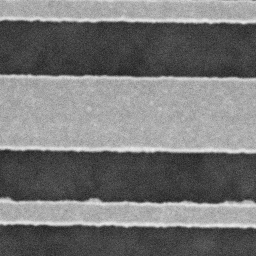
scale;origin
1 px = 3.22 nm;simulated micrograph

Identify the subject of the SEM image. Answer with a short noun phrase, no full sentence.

lines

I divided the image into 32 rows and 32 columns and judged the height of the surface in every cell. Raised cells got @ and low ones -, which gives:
@@@@@@@@@@@@@@@@@@@@@@@@@@@@@@@@
@@@@@@@@@@@@@@@@@@@@@@@@@@@@@@@@
---@-@@@@@@@@@@@@@@@@@@@@@@@@@@@
--------------------------------
--------------------------------
--------------------------------
--------------------------------
--------------------------------
--------------------------------
@@@@----------------------------
@@@@@@@@@@@@@@@@@@@@@@@@@@@@@@@@
@@@@@@@@@@@@@@@@@@@@@@@@@@@@@@@@
@@@@@@@@@@@@@@@@@@@@@@@@@@@@@@@@
@@@@@@@@@@@@@@@@@@@@@@@@@@@@@@@@
@@@@@@@@@@@@@@@@@@@@@@@@@@@@@@@@
@@@@@@@@@@@@@@@@@@@@@@@@@@@@@@@@
@@@@@@@@@@@@@@@@@@@@@@@@@@@@@@@@
@@@@@@@@@@@@@@@@@@@@@@@@@@@@@@@@
@@@@@@@@@@@@@@@@@@@@@@@@@@@@@@@@
--------------------------------
--------------------------------
--------------------------------
--------------------------------
--------------------------------
--------------------------------
@@@@@@@@@@@@@@@@@@@@@@@@@@-@@---
@@@@@@@@@@@@@@@@@@@@@@@@@@@@@@@@
@@@@@@@@@@@@@@@@@@@@@@@@@@@@@@@@
--------------------------------
--------------------------------
--------------------------------
--------------------------------